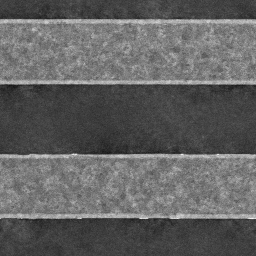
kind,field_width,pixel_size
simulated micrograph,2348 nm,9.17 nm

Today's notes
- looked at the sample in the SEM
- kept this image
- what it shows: one or a few lines or trenches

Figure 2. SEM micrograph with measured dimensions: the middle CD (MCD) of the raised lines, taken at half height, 60.9 px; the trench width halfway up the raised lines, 0.674 micrometres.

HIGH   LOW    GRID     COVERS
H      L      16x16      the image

LLLLLLLLLLLLLLLL
HHHHHHHHHHHHHHHH
HHHHHHHHHHHHHHHH
HHHHHHHHHHHHHHHH
HHHHHHHHHHHHHHHH
LLLLLLLLLLLLLLLL
LLLLLLLLLLLLLLLL
LLLLLLLLLLLLLLLL
LLLLLLLLLLLLLLLL
LLLLLLLLLLLLLLLL
HHHHHHHHHHHHHHHH
HHHHHHHHHHHHHHHH
HHHHHHHHHHHHHHHH
LHHHHLLLLLLLLHHL
LLLLLLLLLLLLLLLL
LLLLLLLLLLLLLLLL